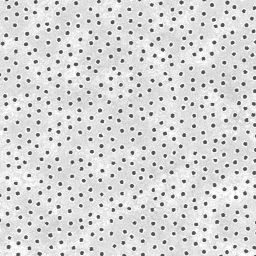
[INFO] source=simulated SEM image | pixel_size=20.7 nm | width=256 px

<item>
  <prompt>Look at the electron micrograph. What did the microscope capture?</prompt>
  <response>a regular array of holes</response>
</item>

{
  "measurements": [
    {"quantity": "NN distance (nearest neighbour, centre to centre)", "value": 9.8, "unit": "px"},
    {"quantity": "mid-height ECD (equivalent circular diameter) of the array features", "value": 4.23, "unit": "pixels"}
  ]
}